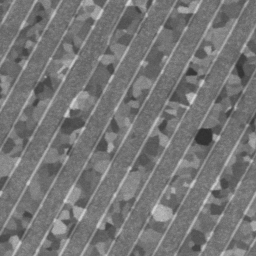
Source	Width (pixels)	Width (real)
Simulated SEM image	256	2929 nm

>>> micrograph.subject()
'parallel lines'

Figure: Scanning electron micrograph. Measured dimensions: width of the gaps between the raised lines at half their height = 218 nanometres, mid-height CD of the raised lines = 21.7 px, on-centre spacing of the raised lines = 467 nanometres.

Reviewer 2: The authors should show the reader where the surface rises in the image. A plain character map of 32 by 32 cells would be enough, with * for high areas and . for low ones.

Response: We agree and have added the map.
**..***...***...***...***...***.
*...***...***..****..***...***..
...***...***...***...***..****..
...***..****..***...***...***...
..***...***...***...***..****..*
..***..***...***...***...***...*
.***...***...***..****..***...**
****..***...***...***...***...**
***...***...***..****..***...***
**...***...***...***...***...***
**...***...***..***...***...***.
*...***...***...***...***..***..
*..****..***...***...***...***..
...***...***...***..****..***...
..***...***...***...***...***...
..***...***..****..***...***...*
.***...***...***...***...***..**
.***..****..****..***...***...**
***...***...***...***...***..***
***..****..***...***...***...***
**...***...***...***..***...***.
**..***...***...***...***...***.
*...***...***..****..***...***..
...***...***...***...***...***..
...***..****..***...***...***...
..***...***...***...***..****..*
.****..****..***...***...***...*
.***...***...***...***..***...**
****..***...***...***...***...**
***...***..****..***...***...***
**...***...***...***...***...***
**...***..****..***...***...***.